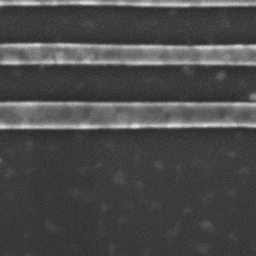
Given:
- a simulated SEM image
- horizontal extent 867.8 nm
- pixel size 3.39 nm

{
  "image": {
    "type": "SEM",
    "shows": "one or a few lines or trenches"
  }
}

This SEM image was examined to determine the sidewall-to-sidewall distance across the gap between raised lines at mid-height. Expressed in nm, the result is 137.